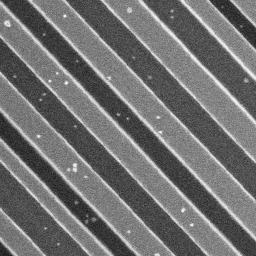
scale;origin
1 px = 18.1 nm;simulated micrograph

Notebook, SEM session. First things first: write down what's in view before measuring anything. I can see lines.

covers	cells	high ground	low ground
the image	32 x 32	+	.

....+++++....+++++.....+++...+++
+....++++.....+++++.....+++...++
++....++++.....+++++.....+++...+
+++....++++.....+++++.....+++...
++++....++++.....+++++.....+++..
.++++....++++.....+++++.....+++.
..++++....++++.....++++......+++
...++++....++++.....++++......++
....++++....++++.....++++......+
.....++++....++++.....++++......
+.....++++....++++.....++++.....
++.....++++....++++.....++++....
+++.....++++....++++.....++++...
++++....++++.....++++....+++++..
.++++....++++....+++++....+++++.
..++++....++++....+++++....+++++
...++++....++++....+++++....++++
....++++....++++....+++++....+++
+....++++....++++....+++++....++
++....++++....++++....+++++....+
+++...+++++....++++....+++++....
.+++...+++++....++++....++++....
..+++...+++++....++++....++++...
...+++...+++++....++++....++++..
....+++...+++++....++++....++++.
.....+++...+++++....++++....++++
......+++...+++++....++++....+++
+......+++...+++++....++++....++
++......+++...+++++....++++....+
+++......+++...++++.....++++....
.+++......++....++++.....++++...
..+++......++....++++.....++++..